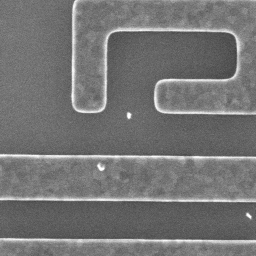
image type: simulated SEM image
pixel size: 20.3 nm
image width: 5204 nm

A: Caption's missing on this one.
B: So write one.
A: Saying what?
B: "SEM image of wiring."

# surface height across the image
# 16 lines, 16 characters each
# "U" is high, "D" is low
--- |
DDDDDUUUUUUUUUUU
DDDDDUUUUUUUUUUU
DDDDDUUDDDDDDDDU
DDDDDUUDDDDDDDDU
DDDDDUUDDDDDDDDU
DDDDUUUDDDUUUUUU
DDDDDUUDDDUUUUUU
DDDDDDDDDDDDDDDD
DDDDDDDDDDDDDDDD
DDDDDDDDDDDDDDDD
UUUUUUUUUUUUUUUU
UUUUUUUUUUUUUUUU
DDDDDDDUUUUUUUUU
DDDDDDDDDDDDDDDD
DDDDDDDDDDDDDDDD
UUUUUUUUUUUUUUUU